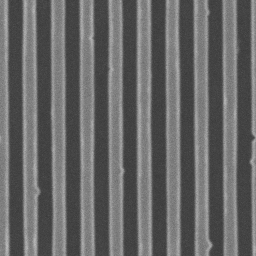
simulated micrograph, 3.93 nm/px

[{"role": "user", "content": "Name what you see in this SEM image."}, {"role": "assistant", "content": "parallel lines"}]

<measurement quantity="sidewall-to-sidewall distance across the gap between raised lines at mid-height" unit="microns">0.0634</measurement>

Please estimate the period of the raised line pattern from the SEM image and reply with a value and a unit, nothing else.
112 nm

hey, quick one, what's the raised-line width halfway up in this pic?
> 0.0492 microns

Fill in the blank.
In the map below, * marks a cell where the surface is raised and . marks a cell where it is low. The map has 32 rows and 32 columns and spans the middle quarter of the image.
....***....***.....***....***...
....***.....**.....***....***...
....***....***.....***....***...
....***....***.....***....***...
....***....***.....***....***...
....***....***.....***....***...
....***.....**.....***....***...
....***.....**.....***....***...
....***.....**.....***....***...
....***.....**.....***....***...
....***.....**.....***....***...
....***.....**.....***....***...
....***.....**.....***....***...
....***.....**.....**.....***...
....***.....**.....**.....***...
....***.....**.....**.....***...
....***.....**.....**.....***...
....***.....**.....**.....***...
....***.....**.....***....***...
....***.....**.....***....***...
....***.....**.....***....***...
....***.....**.....***....***...
....***.....**.....***....***...
....***.....**.....***....***...
....***.....**.....***....***...
....***.....**.....***....***...
....***.....***....***....***...
....***.....***....***....***...
....***.....**.....***....***...
....***.....**.....***....***...
....***.....***....***....***...
....***.....***....***....***...